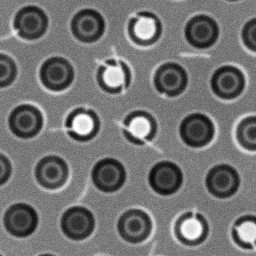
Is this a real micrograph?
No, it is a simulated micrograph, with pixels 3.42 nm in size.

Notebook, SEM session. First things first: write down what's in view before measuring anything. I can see an array of small figures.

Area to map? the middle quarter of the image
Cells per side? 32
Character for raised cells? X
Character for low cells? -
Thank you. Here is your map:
--XXXXXXX-------XXXXXXX------XXX
---XXXXX---XXX---XXXXXX-------XX
---XXXXX--XXXXX--XXXXX---XXX---X
---XXXXX--XXXXX--XXXXX--XXXXX--X
--XXXXXX---XXXX--XXXXX--XXXXX--X
--XXXXXXX-------XXXXXX---XXX---X
XXXXXXXXXX-----XXXXXXXX-------XX
XXXXXXXXXXX---XXXXXXXXXX-----XXX
XXXXXXXXXXXXXXXXXXXXXXXXXXXXXXXX
XXXXXXXXXXXXXXXXXXXXXXXXXXXXXXXX
XXXXXXXXXXXXXXXXXXXXXXXXXXXXXXXX
XX-----XXXXXXXXXXX--XXXXXXXXXXXX
X-------XXXXXXXX------XXXXXXXXX-
---XXX---XXXXXX--------XXXXXXX--
---XXX---XXXXXX--XXXX--XXXXXX---
---XXXX--XXXXXX--XXXX---XXXXX--X
X--XXX---XXXXX---XXXX---XXXXX--X
X--------XXXXXX--XXX---XXXXXX--X
XX-----XXXXXXXX--------XXXXXX---
XXXX--XXXXXXXXXX-----XXXXXXXXX--
XXXXXXXXXXXXXXXXXXXXXXXXXXXXXXX-
XXXXXXXXXXXXXXXXXXXXXXXXXXXXXXXX
XXXXXXXXXXXXXXXXXXXXXXXXXXXXXXXX
XXXXXXXXXX---XXXXXXXXXXXXXXXXXXX
XXXXXXXX------XXXXXXXXXX----XXXX
-XXXXXX--------XXXXXXX-------XXX
--XXXXX--XXXX---XXXXX---XXX--XXX
--XXXXX--XXXX---XXXXX--XXXXX--XX
-XXXXXX--XXXX---XXXXX--XXXXX--XX
-XXXXXX--XXXX--XXXXXX--XXXXX--XX
XXXXXXXX-------XXXXXX---XXX--XXX
XXXXXXXX------XXXXXXXX-------XXX